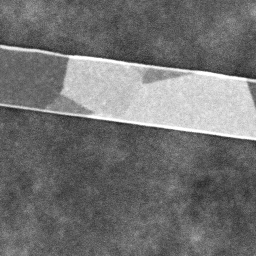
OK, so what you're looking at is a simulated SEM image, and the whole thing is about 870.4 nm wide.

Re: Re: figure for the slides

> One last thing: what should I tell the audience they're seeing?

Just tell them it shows one or a few lines or trenches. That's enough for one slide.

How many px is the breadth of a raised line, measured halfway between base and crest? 58.4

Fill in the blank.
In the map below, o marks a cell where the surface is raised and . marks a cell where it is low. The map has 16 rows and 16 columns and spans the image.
................
................
................
oooo............
ooooooooooooo...
oooooooooooooooo
oooooooooooooooo
.......ooooooooo
..............oo
................
................
................
................
................
................
................